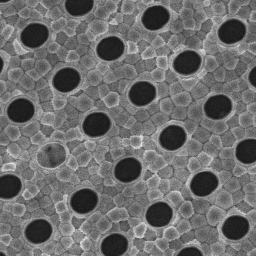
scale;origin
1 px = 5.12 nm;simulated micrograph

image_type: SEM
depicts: a regular array of holes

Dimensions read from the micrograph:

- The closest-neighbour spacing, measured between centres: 276 nm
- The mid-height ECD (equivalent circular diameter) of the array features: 136 nm